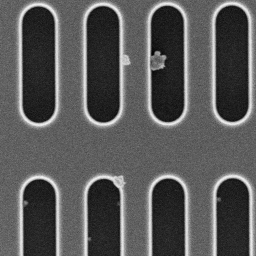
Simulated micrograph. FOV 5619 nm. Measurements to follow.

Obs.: groups of lines, slits or small figures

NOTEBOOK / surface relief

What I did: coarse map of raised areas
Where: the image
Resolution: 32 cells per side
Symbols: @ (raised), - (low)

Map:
@@@@@@@@@@@@@@@@@@@@@@@@@@@@@@@@
@@@----@@@@----@@@@----@@@@----@
@@@----@@@@----@@@@----@@@@----@
@@@----@@@@----@@@@----@@@@----@
@@@----@@@@----@@@@----@@@@----@
@@@----@@@@----@@@@----@@@@----@
@@@----@@@@----@@@@----@@@@----@
@@@----@@@@----@@@@@---@@@@----@
@@@----@@@@----@@@@@---@@@@----@
@@@----@@@@----@@@@----@@@@----@
@@@----@@@@----@@@@----@@@@----@
@@@----@@@@----@@@@----@@@@----@
@@@----@@@@----@@@@----@@@@----@
@@@----@@@@----@@@@----@@@@----@
@@@----@@@@----@@@@----@@@@----@
@@@@@@@@@@@@@@@@@@@@@@@@@@@@@@@@
@@@@@@@@@@@@@@@@@@@@@@@@@@@@@@@@
@@@@@@@@@@@@@@@@@@@@@@@@@@@@@@@@
@@@@@@@@@@@@@@@@@@@@@@@@@@@@@@@@
@@@@@@@@@@@@@@@@@@@@@@@@@@@@@@@@
@@@@@@@@@@@@@@@@@@@@@@@@@@@@@@@@
@@@@@@@@@@@@@@@@@@@@@@@@@@@@@@@@
@@@@--@@@@@@--@@@@@@--@@@@@@--@@
@@@----@@@@----@@@@----@@@@----@
@@@----@@@@----@@@@----@@@@----@
@@@----@@@@----@@@@----@@@@----@
@@@----@@@@----@@@@----@@@@----@
@@@----@@@@----@@@@----@@@@----@
@@@----@@@@----@@@@----@@@@----@
@@@----@@@@----@@@@----@@@@----@
@@@----@@@@----@@@@----@@@@----@
@@@----@@@@----@@@@----@@@@----@